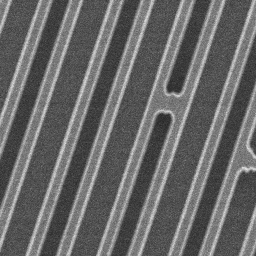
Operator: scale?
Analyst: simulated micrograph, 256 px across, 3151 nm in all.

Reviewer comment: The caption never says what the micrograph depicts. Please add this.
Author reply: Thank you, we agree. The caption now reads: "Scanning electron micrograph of parallel lines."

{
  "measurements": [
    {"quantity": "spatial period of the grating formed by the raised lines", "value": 0.413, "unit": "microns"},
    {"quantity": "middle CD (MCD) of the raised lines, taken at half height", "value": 142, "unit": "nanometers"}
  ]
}